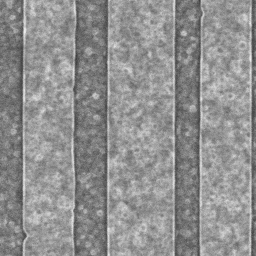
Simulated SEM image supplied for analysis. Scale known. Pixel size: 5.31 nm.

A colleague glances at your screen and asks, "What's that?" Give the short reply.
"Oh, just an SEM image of one or a few lines or trenches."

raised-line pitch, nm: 469